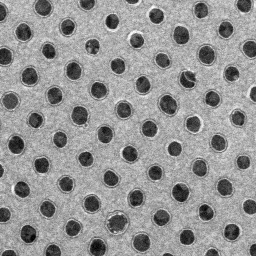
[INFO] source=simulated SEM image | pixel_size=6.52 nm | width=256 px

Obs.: a regular array of raised bodies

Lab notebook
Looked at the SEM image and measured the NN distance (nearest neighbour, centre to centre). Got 30.9 pixels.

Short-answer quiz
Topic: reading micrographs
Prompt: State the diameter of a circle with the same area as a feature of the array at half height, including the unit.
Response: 111 nm